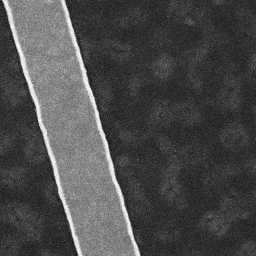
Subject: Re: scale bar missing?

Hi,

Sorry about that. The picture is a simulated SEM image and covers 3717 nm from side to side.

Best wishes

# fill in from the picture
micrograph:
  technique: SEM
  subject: one or a few lines or trenches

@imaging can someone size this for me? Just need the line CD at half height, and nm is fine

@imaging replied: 808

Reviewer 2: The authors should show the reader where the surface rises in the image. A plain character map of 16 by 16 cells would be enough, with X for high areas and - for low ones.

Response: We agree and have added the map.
XXXX------------
-XXX------------
-XXXX-----------
-XXXX-----------
--XXX-----------
--XXXX----------
--XXXX----------
--XXXX----------
---XXX----------
---XXXX---------
---XXXX---------
----XXX---------
----XXXX--------
----XXXX--------
-----XXX--------
-----XXXX-------